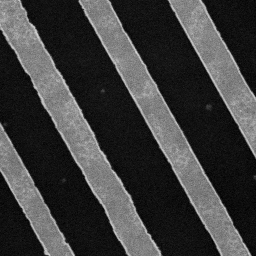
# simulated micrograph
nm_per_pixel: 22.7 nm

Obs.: one or a few lines or trenches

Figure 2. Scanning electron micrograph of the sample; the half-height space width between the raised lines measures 1200 nanometers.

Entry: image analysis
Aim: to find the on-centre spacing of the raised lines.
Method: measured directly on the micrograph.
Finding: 1780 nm